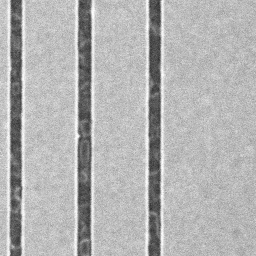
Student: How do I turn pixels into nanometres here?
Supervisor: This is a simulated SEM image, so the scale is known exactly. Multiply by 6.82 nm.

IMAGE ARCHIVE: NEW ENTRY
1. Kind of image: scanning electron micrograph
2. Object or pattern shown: one or a few lines or trenches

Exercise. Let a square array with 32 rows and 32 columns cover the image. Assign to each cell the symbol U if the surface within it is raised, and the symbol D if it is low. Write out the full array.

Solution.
UDDUUUUUUUDDUUUUUUDDUUUUUUUUUUUU
UDDUUUUUUUDDUUUUUUDDUUUUUUUUUUUU
UDDUUUUUUUDDUUUUUUDDUUUUUUUUUUUU
UDDUUUUUUUDDUUUUUUDDUUUUUUUUUUUU
UDDUUUUUUUDDUUUUUUDDUUUUUUUUUUUU
UDDUUUUUUUDDUUUUUUDDUUUUUUUUUUUU
UDDUUUUUUUDDUUUUUUDDUUUUUUUUUUUU
UDDUUUUUUUDDUUUUUUDDUUUUUUUUUUUU
UDDUUUUUUUDDUUUUUUDDUUUUUUUUUUUU
UDDUUUUUUUDDUUUUUUDDUUUUUUUUUUUU
UDDUUUUUUUDDUUUUUUDDUUUUUUUUUUUU
UDDUUUUUUUDDUUUUUUDDUUUUUUUUUUUU
UDDUUUUUUUDDUUUUUUDDUUUUUUUUUUUU
UDDUUUUUUUDDUUUUUUDDUUUUUUUUUUUU
UDDUUUUUUUDDUUUUUUDDUUUUUUUUUUUU
UDDUUUUUUUDDUUUUUUDDUUUUUUUUUUUU
UDDUUUUUUUDDUUUUUUDDUUUUUUUUUUUU
UDDUUUUUUUDDUUUUUUDDUUUUUUUUUUUU
UDDUUUUUUUUDUUUUUUDDUUUUUUUUUUUU
UDDUUUUUUDUUUUUUUUDDUUUUUUUUUUUU
UDDUUUUUUDDDUUUUUUDDUUUUUUUUUUUU
UDDUUUUUUDDDUUUUUUDDUUUUUUUUUUUU
UDDUUUUUUDDDUUUUUUDDUUUUUUUUUUUU
UDDUUUUUUDDDUUUUUUDDUUUUUUUUUUUU
UDDUUUUUUDDDUUUUUUDDUUUUUUUUUUUU
UDDUUUUUUDDDUUUUUUDDUUUUUUUUUUUU
UDDUUUUUUDDDUUUUUUDDUUUUUUUUUUUU
UDDUUUUUUUDDUUUUUUDDUUUUUUUUUUUU
UDDUUUUUUUDDUUUUUUDDUUUUUUUUUUUU
UDDUUUUUUDDDUUUUUUDDUUUUUUUUUUUU
UDDUUUUUUDDUUUUUUUDDUUUUUUUUUUUU
UDDUUUUUUDDUUUUUUUDDUUUUUUUUUUUU